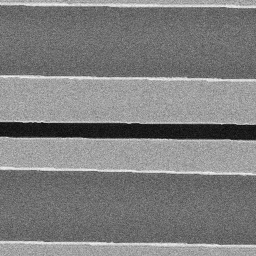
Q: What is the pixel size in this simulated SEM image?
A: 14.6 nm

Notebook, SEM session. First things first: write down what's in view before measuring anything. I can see lines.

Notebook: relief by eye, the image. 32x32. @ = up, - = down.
--@@@@@@@@@@@@@@@@@@@@@@@@@@@@@@
--------------------------------
--------------------------------
--------------------------------
--------------------------------
--------------------------------
--------------------------------
--------------------------------
--------------------------------
--------------------------------
@@@@@@@@@@@@@@@@@@@@@@@@@@@@@@@@
@@@@@@@@@@@@@@@@@@@@@@@@@@@@@@@@
@@@@@@@@@@@@@@@@@@@@@@@@@@@@@@@@
@@@@@@@@@@@@@@@@@@@@@@@@@@@@@@@@
@@@@@@@@@@@@@@@@@@@@@@@@@@@@@@@@
---------------------------@-@@@
--------------------------------
@@@@@@@@@@@@@@@@@@@@@-----------
@@@@@@@@@@@@@@@@@@@@@@@@@@@@@@@@
@@@@@@@@@@@@@@@@@@@@@@@@@@@@@@@@
@@@@@@@@@@@@@@@@@@@@@@@@@@@@@@@@
------------------@@@@@@@@@@@@@@
--------------------------------
--------------------------------
--------------------------------
--------------------------------
--------------------------------
--------------------------------
--------------------------------
--------------------------------
@@@@@@@@@@@@@@@@----------------
@@@@@@@@@@@@@@@@@@@@@@@@@@@@@@@@